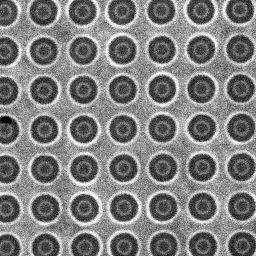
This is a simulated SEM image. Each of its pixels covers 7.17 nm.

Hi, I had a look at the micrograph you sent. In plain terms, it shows an array of small figures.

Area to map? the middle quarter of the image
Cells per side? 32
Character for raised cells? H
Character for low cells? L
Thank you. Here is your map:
HHHHHHHHHHHHHHHHHHHHHHHHHHHHHHHH
HHHHHHHHHHHHHHHHHHHHHHHHHHHHHHHH
HHHHHHHHHHHHHHHHHHHHHHHHLLHHHHHH
HHHLLLLHHHHHLLLLLHHHHHLLLLLHHHHH
HHLLLLLLHHHLLLLLLLHHHLLLLLLLHHHL
HLLLLLLLHHHLLLLLLLHHHLLLLLLLHHHL
HLLLLLLLLHHLLLLLLLHHHLLLLLLLHHHL
HLLLLLLLHHHLLLLLLLHHHLLLLLLLHHHL
HHLLLLLLHHHHLLLLLLHHHHLLLLLLHHHL
HHHLLLLHHHHHHLLLLHHHHHHLLLLHHHHH
HHHHHHHHHHHHHHHHHHHHHHHHHHHHHHHH
HHHHHHHHHHHHHHHHHHHHHHHHHHHHHHHH
HHHHHHHHHHHHHHHHHHHHHHHHLHHHHHHH
HHHLLLLHHHHHLLLLLHHHHHLLLLLHHHHH
HHLLLLLLHHHLLLLLLLHHHLLLLLLLHHHL
HLLLLLLLLHHLLLLLLLHHHLLLLLLLHHHL
HLLLLLLLLHHLLLLLLLLHHLLLLLLLHHHL
HLLLLLLLLHHLLLLLLLHHHLLLLLLLHHHL
HHLLLLLLHHHHLLLLLLHHHHLLLLLHHHHH
HHHLLLLHHHHHHLLLHHHHHHHLLLHHHHHH
HHHHHHHHHHHHHHHHHHHHHHHHHHHHHHHH
HHHHHHHHHHHHHHHHHHHHHHHHHHHHHHHH
HHHHLLHHHHHHHHLLHHHHHHHHLLHHHHHH
HHHLLLLLHHHHLLLLLLHHHHLLLLLHHHHH
HHLLLLLLHHHHLLLLLLHHHLLLLLLLHHHL
HLLLLLLLLHHLLLLLLLLHHLLLLLLLHHHL
HLLLLLLLLHHLLLLLLLLHHLLLLLLLHHHL
HHLLLLLLHHHLLLLLLLHHHLLLLLLLHHHL
HHLLLLLLHHHHLLLLLLHHHHLLLLLLHHHH
HHHLLLLHHHHHHHLLHHHHHHHLLLHHHHHH
HHHHHHHHHHHHHHHHHHHHHHHHHHHHHHHH
HHHHHHHHHHHHHHHHHHHHHHHHHHHHHHHH